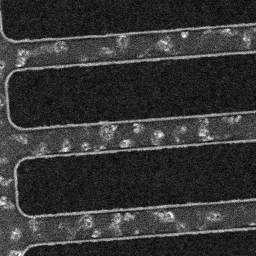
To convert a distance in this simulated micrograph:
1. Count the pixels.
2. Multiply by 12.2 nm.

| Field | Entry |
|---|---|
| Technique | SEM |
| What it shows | one or a few lines or trenches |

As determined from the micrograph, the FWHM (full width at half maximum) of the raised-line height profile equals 729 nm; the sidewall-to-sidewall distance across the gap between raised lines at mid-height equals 0.339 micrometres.